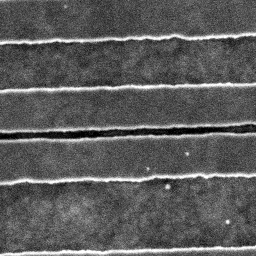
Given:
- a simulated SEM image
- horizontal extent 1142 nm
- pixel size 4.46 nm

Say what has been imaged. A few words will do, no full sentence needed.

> lines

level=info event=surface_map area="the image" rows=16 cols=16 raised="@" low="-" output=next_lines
@@@@@@@@@@@@@@@@
@@@@@@@@@@@@@@@@
@@@@@@@@--------
----------------
----------------
------@@@@@@@@@@
@@@@@@@@@@@@@@@@
@@@@@@@@@@@@@@@@
@@@@--@@@@@@@@@@
@@@@@@@@@@@@@@@@
@@@@@@@@@@@@@@@@
----------------
----------------
----------------
----------------
-------------@@@